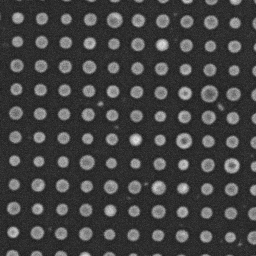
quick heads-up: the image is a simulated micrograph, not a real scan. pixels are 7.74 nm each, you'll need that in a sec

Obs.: a regular array of raised bodies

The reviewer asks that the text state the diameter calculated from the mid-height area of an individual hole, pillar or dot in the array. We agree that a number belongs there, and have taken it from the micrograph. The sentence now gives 88.7 nm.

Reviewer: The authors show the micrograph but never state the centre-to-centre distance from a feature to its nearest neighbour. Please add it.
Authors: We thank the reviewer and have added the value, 183 nanometers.